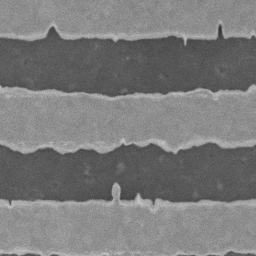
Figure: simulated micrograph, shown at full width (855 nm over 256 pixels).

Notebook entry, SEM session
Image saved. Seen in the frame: one or a few lines or trenches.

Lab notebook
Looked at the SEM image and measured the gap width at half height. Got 56.3 px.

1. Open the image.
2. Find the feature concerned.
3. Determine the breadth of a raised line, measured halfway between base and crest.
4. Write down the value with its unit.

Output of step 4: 176 nm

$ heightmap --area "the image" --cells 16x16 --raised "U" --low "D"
UUUUUUUUUUUUUUUU
UUUUUUUUUUUUUUUU
DDDDDDDDDDDDDDDD
DDDDDDDDDDDDDDDD
DDDDDDDDDDDDDDDD
DDDDDDDDDDDDDDDD
UUUUUUUUUUUUUUUU
UUUUUUUUUUUUUUUU
UUUUUUUUUUUUUUUU
DDDDDDDDDDDDDDDD
DDDDDDDDDDDDDDDD
DDDDDDDDDDDDDDDD
DDDDDDDUDDDDDDDD
UUUUUUUUUUUUUUUU
UUUUUUUUUUUUUUUU
UUUUUUUUUUUUUUUU